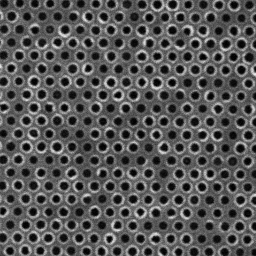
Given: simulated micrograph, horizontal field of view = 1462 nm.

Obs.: a regular array of holes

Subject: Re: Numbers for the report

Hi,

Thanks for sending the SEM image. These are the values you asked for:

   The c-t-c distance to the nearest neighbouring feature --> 0.084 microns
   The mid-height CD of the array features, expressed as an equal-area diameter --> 51.1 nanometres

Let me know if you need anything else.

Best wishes